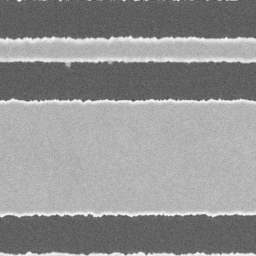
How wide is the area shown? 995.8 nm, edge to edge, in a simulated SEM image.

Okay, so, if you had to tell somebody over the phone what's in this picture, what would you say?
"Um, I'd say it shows lines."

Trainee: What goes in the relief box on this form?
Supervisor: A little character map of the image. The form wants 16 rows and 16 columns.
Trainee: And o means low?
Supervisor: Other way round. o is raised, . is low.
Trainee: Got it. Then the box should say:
................
................
.ooooooooooooooo
oooooooooooooooo
................
................
oooooooooooooooo
oooooooooooooooo
oooooooooooooooo
oooooooooooooooo
oooooooooooooooo
oooooooooooooooo
oooooooooooooooo
................
................
................